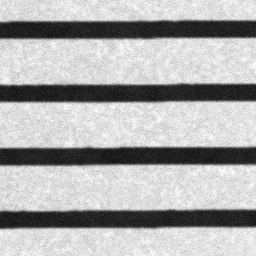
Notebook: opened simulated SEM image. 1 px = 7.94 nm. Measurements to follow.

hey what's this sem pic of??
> lines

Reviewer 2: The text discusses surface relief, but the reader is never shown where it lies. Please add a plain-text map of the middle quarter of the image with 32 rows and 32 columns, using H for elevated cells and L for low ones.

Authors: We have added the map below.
HHHHHHHHHHHHHHHHHHHHHHHHHHHHHHHH
HHHHHHHHHHHHHHHHHHHHHHHHHHHHHHHH
HHHHHHHHHHHHHHHHHHHHHHHHHHHHHHHH
HHHHHHHHHHHHHHHHHHHHHHHHHHHHHHHH
HHHHHHHHHHHHHHHHHHHHHHHHHHHHHHHH
LLLLLLLLLLLLLLLLLLLLLLLLLLLLLLLL
LLLLLLLLLLLLLLLLLLLLLLLLLLLLLLLL
LLLLLLLLLLLLLLLLLLLLLLLLLLLLLLLL
LLLLLLLLLLLLLLLLLLLLLLLLLLLLLLLL
LLLLLLLLLLLLLLLLLLLLLLLLLLLLLLLL
HHHHHHHHHHHHHHHHHHHHHHHHHHHHHHHH
HHHHHHHHHHHHHHHHHHHHHHHHHHHHHHHH
HHHHHHHHHHHHHHHHHHHHHHHHHHHHHHHH
HHHHHHHHHHHHHHHHHHHHHHHHHHHHHHHH
HHHHHHHHHHHHHHHHHHHHHHHHHHHHHHHH
HHHHHHHHHHHHHHHHHHHHHHHHHHHHHHHH
HHHHHHHHHHHHHHHHHHHHHHHHHHHHHHHH
HHHHHHHHHHHHHHHHHHHHHHHHHHHHHHHH
HHHHHHHHHHHHHHHHHHHHHHHHHHHHHHHH
HHHHHHHHHHHHHHHHHHHHHHHHHHHHHHHH
HHHHHHHHHHHHHHHHHHHHHHHHHHHHHHHH
LLLLLLLLLLLLLLLLLLLLLLLLLLLLLLLL
LLLLLLLLLLLLLLLLLLLLLLLLLLLLLLLL
LLLLLLLLLLLLLLLLLLLLLLLLLLLLLLLL
LLLLLLLLLLLLLLLLLLLLLLLLLLLLLLLL
LLLLLLHHHHHHHHHHHHHHHHHHHHHHHHHH
HHHHHHHHHHHHHHHHHHHHHHHHHHHHHHHH
HHHHHHHHHHHHHHHHHHHHHHHHHHHHHHHH
HHHHHHHHHHHHHHHHHHHHHHHHHHHHHHHH
HHHHHHHHHHHHHHHHHHHHHHHHHHHHHHHH
HHHHHHHHHHHHHHHHHHHHHHHHHHHHHHHH
HHHHHHHHHHHHHHHHHHHHHHHHHHHHHHHH